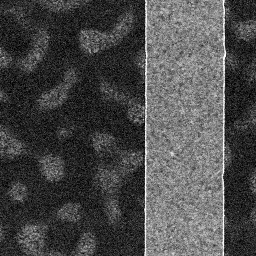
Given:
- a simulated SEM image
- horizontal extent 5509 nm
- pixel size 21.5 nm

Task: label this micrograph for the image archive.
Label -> one or a few lines or trenches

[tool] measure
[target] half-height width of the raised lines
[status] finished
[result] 1680 nm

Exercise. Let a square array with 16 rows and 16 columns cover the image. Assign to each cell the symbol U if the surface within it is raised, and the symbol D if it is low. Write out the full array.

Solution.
DDDDDDDDDUUUUUDD
DDDDDDDDDUUUUUDD
DDDDDDDDDUUUUUDD
DDDDDDDDDUUUUUDD
DDDDDDDDDUUUUUDD
DDDDDDDDDUUUUUDD
DDDDDDDDDUUUUUDD
DDDDDDDDDUUUUUDD
DDDDDDDDDUUUUUDD
DDDDDDDDDUUUUUDD
DDDDDDDDDUUUUUDD
DDDDDDDDDUUUUUDD
DDDDDDDDDUUUUUDD
DDDDDDDDDUUUUUDD
DDDDDDDDDUUUUUDD
DDDDDDDDDUUUUUDD